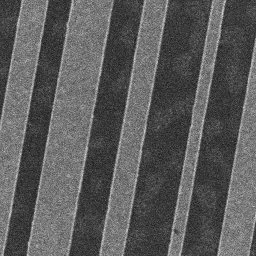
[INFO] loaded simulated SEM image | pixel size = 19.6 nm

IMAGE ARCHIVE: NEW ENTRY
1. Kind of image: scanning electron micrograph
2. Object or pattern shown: one or a few lines or trenches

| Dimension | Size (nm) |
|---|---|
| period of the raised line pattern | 1200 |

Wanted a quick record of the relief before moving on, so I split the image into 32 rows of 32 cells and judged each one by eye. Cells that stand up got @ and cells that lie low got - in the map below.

---@@@---@@@@@----@@@------@----
---@@@---@@@@@----@@@-----@@----
--@@@@---@@@@@----@@@-----@@----
--@@@---@@@@@@---@@@------@@----
--@@@---@@@@@----@@@------@-----
--@@@---@@@@@----@@@------@-----
--@@@---@@@@@----@@@------@-----
--@@@---@@@@@----@@@-----@@-----
-@@@----@@@@@----@@@-----@@----@
-@@@---@@@@@----@@@------@@----@
-@@@---@@@@@----@@@------@-----@
-@@@---@@@@@----@@@------@-----@
-@@@---@@@@@----@@@-----@@-----@
@@@@---@@@@@----@@@-----@@----@@
@@@---@@@@@@----@@------@@----@@
@@@---@@@@@----@@@------@-----@@
@@@---@@@@@----@@@------@-----@@
@@@---@@@@@----@@@------@-----@@
@@@---@@@@@----@@@-----@@-----@@
@@@---@@@@@----@@@-----@@----@@@
@@---@@@@@@---@@@------@@----@@@
@@---@@@@@----@@@------@-----@@@
@@---@@@@@----@@@------@-----@@@
@@---@@@@@----@@@------@-----@@@
@@---@@@@@----@@@-----@@-----@@@
@----@@@@@----@@@-----@@----@@@@
@---@@@@@----@@@------@@----@@@@
@---@@@@@----@@@------@-----@@@@
@---@@@@@----@@@------@-----@@@@
@---@@@@@----@@@-----@@-----@@@@
@---@@@@@----@@@-----@@----@@@@-
---@@@@@@----@@------@@----@@@@-